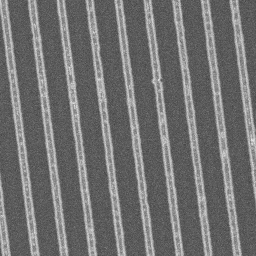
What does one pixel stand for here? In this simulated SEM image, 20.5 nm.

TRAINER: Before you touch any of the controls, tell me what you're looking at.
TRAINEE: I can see parallel lines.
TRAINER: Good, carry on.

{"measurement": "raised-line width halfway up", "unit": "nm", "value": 137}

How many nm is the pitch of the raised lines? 586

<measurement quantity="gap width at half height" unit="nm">449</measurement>